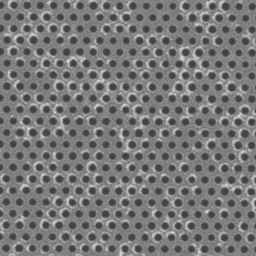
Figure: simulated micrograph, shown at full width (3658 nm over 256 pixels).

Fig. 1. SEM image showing a regular array of holes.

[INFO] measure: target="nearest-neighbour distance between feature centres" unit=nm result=184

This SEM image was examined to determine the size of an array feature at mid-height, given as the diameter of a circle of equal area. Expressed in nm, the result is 109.